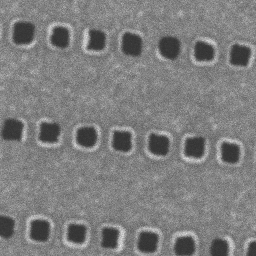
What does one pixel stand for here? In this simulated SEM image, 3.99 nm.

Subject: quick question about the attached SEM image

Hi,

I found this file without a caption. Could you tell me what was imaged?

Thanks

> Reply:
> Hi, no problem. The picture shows a regular array of holes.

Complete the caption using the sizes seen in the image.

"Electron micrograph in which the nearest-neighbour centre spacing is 143 nm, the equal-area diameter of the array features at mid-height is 87.5 nanometres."